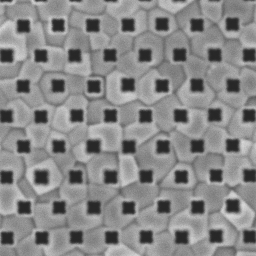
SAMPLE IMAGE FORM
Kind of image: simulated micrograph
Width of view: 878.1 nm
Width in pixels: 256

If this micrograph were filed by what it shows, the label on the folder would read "a regular array of holes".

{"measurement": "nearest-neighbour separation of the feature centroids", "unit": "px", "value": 34.3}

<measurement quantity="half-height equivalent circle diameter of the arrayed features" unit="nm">48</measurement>